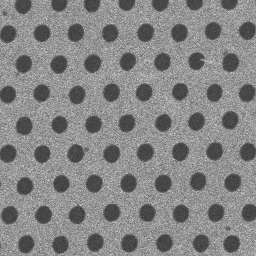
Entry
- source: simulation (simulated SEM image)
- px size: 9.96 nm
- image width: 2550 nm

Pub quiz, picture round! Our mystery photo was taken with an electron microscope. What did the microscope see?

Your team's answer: a regular array of holes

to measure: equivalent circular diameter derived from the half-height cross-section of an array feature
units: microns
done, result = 0.163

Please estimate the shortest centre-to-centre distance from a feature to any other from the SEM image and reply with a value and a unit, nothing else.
334 nanometres